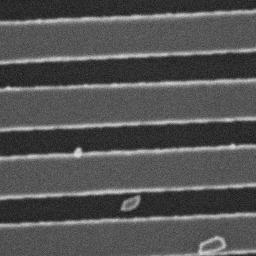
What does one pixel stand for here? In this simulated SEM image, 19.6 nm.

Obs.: lines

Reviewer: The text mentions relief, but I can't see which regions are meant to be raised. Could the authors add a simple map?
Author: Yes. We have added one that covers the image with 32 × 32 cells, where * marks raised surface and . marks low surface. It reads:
................................
..............................**
......**************************
********************************
********************************
********************************
****************************....
*******.........................
................................
................................
.................***************
********************************
********************************
********************************
********************************
*****************...............
................................
................................
.........................*******
....****************************
********************************
********************************
********************************
****************************....
*****...........................
................................
................................
............********************
********************************
********************************
********************************
********************************